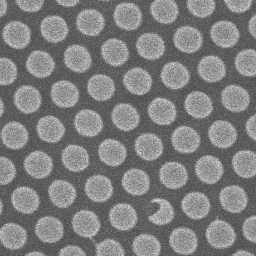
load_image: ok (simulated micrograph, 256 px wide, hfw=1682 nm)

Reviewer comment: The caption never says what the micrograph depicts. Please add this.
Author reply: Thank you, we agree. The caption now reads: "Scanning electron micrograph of a regular array of raised bodies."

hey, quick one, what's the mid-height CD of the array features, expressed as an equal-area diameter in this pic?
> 0.176 µm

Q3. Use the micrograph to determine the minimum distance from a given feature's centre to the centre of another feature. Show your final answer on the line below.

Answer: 244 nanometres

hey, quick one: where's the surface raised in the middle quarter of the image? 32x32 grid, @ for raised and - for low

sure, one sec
-@@@@@-------------------@@@@@--
--@@@------------@@@-----@@@@@@-
---------------@@@@@@---@@@@@@@-
-------@@@@----@@@@@@@---@@@@@@-
@-----@@@@@@---@@@@@@@---@@@@@@-
@@----@@@@@@@--@@@@@@@----@@@@--
@@@---@@@@@@@---@@@@@-----------
@@@@--@@@@@@------@-------------
@@@-----@@@--------------------@
@@@-------------------@@@@@---@@
@@-----------@@@@----@@@@@@@--@@
------------@@@@@@---@@@@@@@---@
----@@@@----@@@@@@---@@@@@@@---@
---@@@@@@---@@@@@@@---@@@@@@----
---@@@@@@---@@@@@@@----@@@@-----
---@@@@@@@---@@@@@--------------
---@@@@@@------@------------@@@@
----@@@@-------------------@@@@@
------------------@@@@@----@@@@@
----------@@@-----@@@@@@---@@@@@
--@@-----@@@@@@---@@@@@@@--@@@@@
@@@@@----@@@@@@---@@@@@@@---@@@@
@@@@@@---@@@@@@---@@@@@@--------
@@@@@@---@@@@@@-----@@@---------
@@@@@@----@@@@@-----------------
@@@@@@-------------------@@@@@--
--@@-------------@@-----@@@@@@--
---------------@@@@@----@@@@@@@-
-------@@@@----@@@@@@---@@@@@@@-
------@@@@@----@@@@@@----@@@@@--
@@---@@@@@@@---@@@@@@----@@@@---
@@@--@@@@@@@---@@@@@@-----------